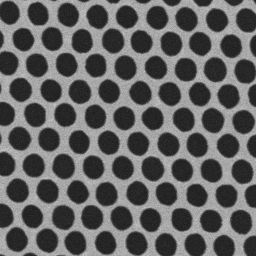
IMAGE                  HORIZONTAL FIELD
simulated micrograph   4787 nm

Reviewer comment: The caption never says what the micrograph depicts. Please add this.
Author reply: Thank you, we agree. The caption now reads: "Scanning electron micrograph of a regular array of holes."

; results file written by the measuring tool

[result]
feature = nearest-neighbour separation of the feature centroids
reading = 0.535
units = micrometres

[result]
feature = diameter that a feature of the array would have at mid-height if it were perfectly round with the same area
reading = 431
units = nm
